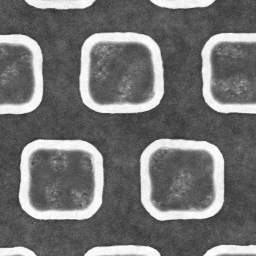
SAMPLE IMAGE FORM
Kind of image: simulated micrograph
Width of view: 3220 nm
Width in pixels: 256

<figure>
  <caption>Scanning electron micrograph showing raised bodies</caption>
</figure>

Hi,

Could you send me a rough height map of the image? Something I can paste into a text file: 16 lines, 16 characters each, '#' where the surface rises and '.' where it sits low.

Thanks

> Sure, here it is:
................
................
#.....###....###
##...#####...###
##...#####...###
##...#####...###
##....###....###
................
................
..####...####...
..####...#####..
..####...#####..
.#####...#####..
................
................
................